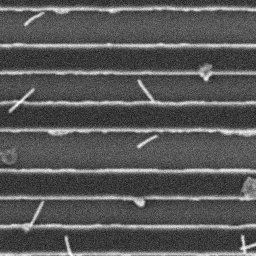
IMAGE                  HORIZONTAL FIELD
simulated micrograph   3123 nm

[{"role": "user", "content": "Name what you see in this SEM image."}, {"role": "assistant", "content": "lines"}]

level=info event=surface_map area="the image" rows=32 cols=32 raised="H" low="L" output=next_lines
HHHHHHHHHHHHHHHHHHHHHHHHHHHHHHHH
LLLLLLLLLLLLLLLLLLLLLLLLLLLLLLLL
LLLLLLLLLLLLLLLLLLLLLLLLLLLLLLLL
LLLLLLLLLLLLLLLLLLLLLLLLLLLLLLLL
LLLLLLLLLLLLLLLLLLLLLLLLLLLLLLLL
LLLLLLLLLLLLLLLLLLLLLLLLLLLLLLLL
HHHHHHHHHHHHHHHHHHHHHHHHHHHHHHHH
HHHHHHHHHHHHHHHHHHHHHHHHHHHHHHHH
HHHHHHHHHHHHHHHHHHHHHHHHHHHHHHHH
LLLLLLLLLLLLLLLLLLLLLLLLLHLLLLLL
LLLLLLLLLLLLLLLLLLLLLLLLLLLLLLLL
LLLLLLLLLLLLLLLLLLLLLLLLLLLLLLLL
LLLLLLLLLLLLLLLLLLLLLLLLLLLLLLLL
HHHHHHHHHHHHHHHHHHHHHHHHHHHHHHHH
HHHHHHHHHHHHHHHHHHHHHHHHHHHHHHHH
HHHHHHHHHHHHHHHHHHHHHHHHHHHHHHHH
LLLLLLLLLLLLLLLLLLLLLLLLLLLLLHHL
LLLLLLLLLLLLLLLLLLLLLLLLLLLLLLLL
LLLLLLLLLLLLLLLLLLLLLLLLLLLLLLLL
LLLLLLLLLLLLLLLLLLLLLLLLLLLLLLLL
LLLLLLLLLLLLLLLLLLLLLLLLLLLLLLLL
HHHHHHHHHHHHHHHHHHHHHHHHHHHHHHHH
HHHHHHHHHHHHHHHHHHHHHHHHHHHHHHHH
HHHHHHHHHHHHHHHHHHHHHHHHHHHHHHHH
HHHHHHHHHHHHHHHHHHHHHHHHHHHHHHHH
LLLLLLLLLLLLLLLLLHLLLLLLLLLLLLLL
LLLLLLLLLLLLLLLLLLLLLLLLLLLLLLLL
LLLLLLLLLLLLLLLLLLLLLLLLLLLLLLLL
HHHHHHHHHHHHHHHHHHHHHHHHHHHHHHHH
HHHHHHHHHHHHHHHHHHHHHHHHHHHHHHHH
HHHHHHHHHHHHHHHHHHHHHHHHHHHHHHHH
HHHHHHHHHHHHHHHHHHHHHHHHHHHHHHHH